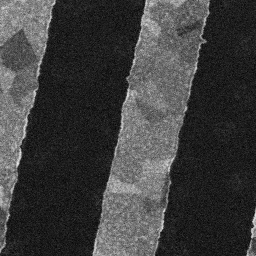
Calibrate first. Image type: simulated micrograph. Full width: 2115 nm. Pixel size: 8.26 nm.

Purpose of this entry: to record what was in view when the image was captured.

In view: one or a few lines or trenches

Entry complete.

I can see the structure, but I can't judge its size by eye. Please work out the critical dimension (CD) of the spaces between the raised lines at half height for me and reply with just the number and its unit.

751 nanometres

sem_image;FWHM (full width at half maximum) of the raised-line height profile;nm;501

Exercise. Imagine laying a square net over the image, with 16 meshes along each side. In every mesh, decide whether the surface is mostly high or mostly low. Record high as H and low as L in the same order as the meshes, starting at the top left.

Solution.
HHHLLLLLLHHHHLLL
HHHLLLLLLHHHHLLL
HHHLLLLLLHHHHLLL
HHHLLLLLHHHHLLLL
HHLLLLLLHHHHLLLL
HHLLLLLLHHHHLLLL
HHLLLLLLHHHHLLLL
HHLLLLLLHHHLLLLL
HLLLLLLHHHHLLLLL
HLLLLLLHHHHLLLLL
HLLLLLLHHHHLLLLL
HLLLLLLHHHHLLLLL
HLLLLLHHHHLLLLLL
LLLLLLHHHHLLLLLL
LLLLLLHHHHLLLLLL
LLLLLLHHHHLLLLLL